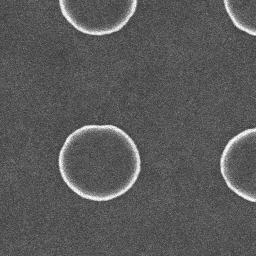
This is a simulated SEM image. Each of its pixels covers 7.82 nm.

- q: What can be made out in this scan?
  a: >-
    raised bodies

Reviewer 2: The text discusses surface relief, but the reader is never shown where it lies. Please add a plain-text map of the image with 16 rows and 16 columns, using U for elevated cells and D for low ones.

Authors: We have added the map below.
DDDDUUUUDDDDDDUU
DDDDDUUUDDDDDDDU
DDDDDDDDDDDDDDDD
DDDDDDDDDDDDDDDD
DDDDDDDDDDDDDDDD
DDDDDDDDDDDDDDDD
DDDDDDDDDDDDDDDD
DDDDDDDDDDDDDDDD
DDDDUUUUDDDDDDDU
DDDDUUUUUDDDDDUU
DDDDUUUUUDDDDDUU
DDDDUUUUDDDDDDUU
DDDDDDDDDDDDDDDD
DDDDDDDDDDDDDDDD
DDDDDDDDDDDDDDDD
DDDDDDDDDDDDDDDD